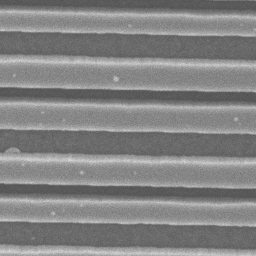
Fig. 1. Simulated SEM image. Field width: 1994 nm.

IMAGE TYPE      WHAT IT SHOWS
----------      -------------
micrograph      lines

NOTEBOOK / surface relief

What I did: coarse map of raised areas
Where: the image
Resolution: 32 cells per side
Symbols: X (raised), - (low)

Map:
--------------------------------
XXXXXXXXXXXXXXXXXX-XX-----------
XXXXXXXXXXXXXXXXXXXXXXXXXXXXXXXX
XXXXXXXXXXXXXXXXXXXXXXXXXXXXXXXX
--------------------------------
--------------------------------
--------------------------------
XXXXXXXXXXXX--------------------
XXXXXXXXXXXXXXXXXXXXXXXXXXXXXXXX
XXXXXXXXXXXXXXXXXXXXXXXXXXXXXXXX
XXXXXXXXXXXXXXXXXXXXXXXXXXXXXXXX
--------------------------------
--------------------------------
XXXXXXXXXXXXXXXXXXXXXXXXXXXXXXXX
XXXXXXXXXXXXXXXXXXXXXXXXXXXXXXXX
XXXXXXXXXXXXXXXXXXXXXXXXXXXXXXXX
------------------------XXXXXXXX
--------------------------------
--------------------------------
--------------------------------
XXXXXXXXXXXXXXXXXXXXXXXXXXXXXXXX
XXXXXXXXXXXXXXXXXXXXXXXXXXXXXXXX
XXXXXXXXXXXXXXXXXXXXXXXXXXXXXXXX
--------------------------------
--------------------------------
XXXXXXXXXXXXXXXXXXXXXXXXXXXXXXXX
XXXXXXXXXXXXXXXXXXXXXXXXXXXXXXXX
XXXXXXXXXXXXXXXXXXXXXXXXXXXXXXXX
--------------------------------
--------------------------------
--------------------------------
XXXXXXXXXXXXXXXXXXXXXXXXXXX-----